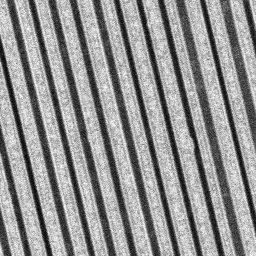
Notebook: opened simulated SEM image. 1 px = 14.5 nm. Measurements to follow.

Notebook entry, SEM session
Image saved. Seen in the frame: parallel lines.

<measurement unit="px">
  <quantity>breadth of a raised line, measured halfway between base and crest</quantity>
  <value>13.7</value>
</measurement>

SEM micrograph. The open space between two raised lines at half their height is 101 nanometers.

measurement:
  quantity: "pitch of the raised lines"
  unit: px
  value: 20.8